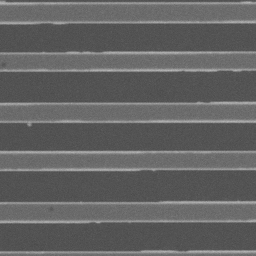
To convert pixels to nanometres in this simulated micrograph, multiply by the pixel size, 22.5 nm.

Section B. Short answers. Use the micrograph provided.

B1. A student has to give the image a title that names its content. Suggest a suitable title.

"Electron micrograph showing lines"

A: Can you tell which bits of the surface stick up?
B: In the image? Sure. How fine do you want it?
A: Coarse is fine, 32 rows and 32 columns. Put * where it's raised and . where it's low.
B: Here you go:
********************************
********************************
********************************
................................
................................
................................
................................
********************************
********************************
................................
................................
................................
................................
********************************
********************************
................................
................................
................................
................................
********************************
********************************
................................
................................
................................
................................
********************************
********************************
********************************
................................
................................
................................
........................**.*****